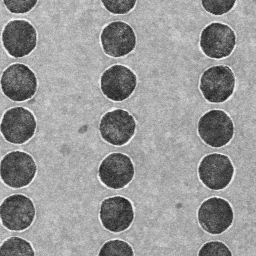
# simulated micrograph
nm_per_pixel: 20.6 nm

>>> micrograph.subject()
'a regular array of holes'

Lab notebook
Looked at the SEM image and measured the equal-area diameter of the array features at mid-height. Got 752 nm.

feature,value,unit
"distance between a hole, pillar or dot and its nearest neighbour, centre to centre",0.891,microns